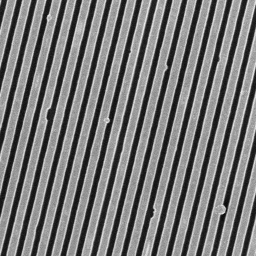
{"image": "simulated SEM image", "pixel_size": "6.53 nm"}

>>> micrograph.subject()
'parallel lines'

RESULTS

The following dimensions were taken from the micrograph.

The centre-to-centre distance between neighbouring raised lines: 95.4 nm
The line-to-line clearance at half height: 0.0389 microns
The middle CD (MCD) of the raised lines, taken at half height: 51.6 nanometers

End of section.